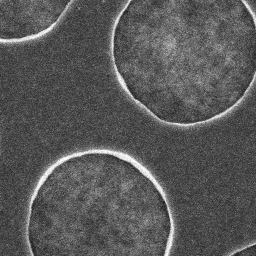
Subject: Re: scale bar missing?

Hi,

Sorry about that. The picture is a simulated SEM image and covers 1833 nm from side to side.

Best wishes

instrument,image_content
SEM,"holes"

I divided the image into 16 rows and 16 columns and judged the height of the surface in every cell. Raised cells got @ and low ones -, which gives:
----@@@@-------@
---@@@@---------
-@@@@@@---------
@@@@@@@---------
@@@@@@@---------
@@@@@@@@-------@
@@@@@@@@@------@
@@@@@@@@@@---@@@
@@@@@@@@@@@@@@@@
@@@@@@@@@@@@@@@@
@@@------@@@@@@@
@@@-------@@@@@@
@@--------@@@@@@
@@---------@@@@@
@@---------@@@@@
@@--------@@@@@-